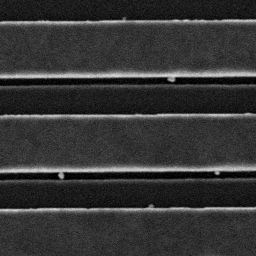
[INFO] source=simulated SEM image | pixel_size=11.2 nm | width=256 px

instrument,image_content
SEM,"lines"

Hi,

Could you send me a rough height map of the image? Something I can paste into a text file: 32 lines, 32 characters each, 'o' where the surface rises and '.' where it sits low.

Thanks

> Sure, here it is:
................................
................................
................................
oooooooooooooooooooooooooooooooo
oooooooooooooooooooooooooooooooo
oooooooooooooooooooooooooooooooo
oooooooooooooooooooooooooooooooo
oooooooooooooooooooooooooooooooo
oooooooooooooooooooooooooooooooo
oooooooooooooooooooo............
................................
................................
................................
................................
oooooooooooooooooooooooooooooooo
oooooooooooooooooooooooooooooooo
oooooooooooooooooooooooooooooooo
oooooooooooooooooooooooooooooooo
oooooooooooooooooooooooooooooooo
oooooooooooooooooooooooooooooooo
oooooooooooooooooooooooooooooooo
................................
................................
................................
................................
................................
oooooooooooooooooooooooooooooooo
oooooooooooooooooooooooooooooooo
oooooooooooooooooooooooooooooooo
oooooooooooooooooooooooooooooooo
oooooooooooooooooooooooooooooooo
oooooooooooooooooooooooooooooooo